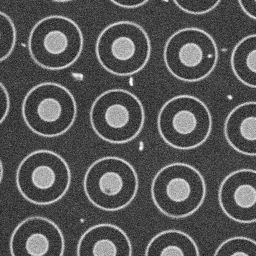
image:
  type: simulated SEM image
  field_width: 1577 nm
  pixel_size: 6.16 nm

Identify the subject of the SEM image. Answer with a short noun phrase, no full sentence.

an array of small figures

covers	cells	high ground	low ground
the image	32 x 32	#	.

###############..#####.....###..
########################.######.
.#####..########################
..##......####...###############
..##......###.....####....######
..##......##.......##......###..
.###......##.......##......##...
####.....####.....###......##...
######.######.....###......##...
######################...#####..
###############################.
.###....######..################
.##......###.....#####...#######
.##......###......##......####..
.##......##.......##......###...
####.....###......##......##....
#####...####.....###......##....
##############..#####....####...
##############################..
####...#########################
###.....####....################
##.......##......###.....#####..
##.......##......##......###....
##......###......##.......##....
###.....###......##......##.....
############....####.....###....
#####################...####....
###...########################..
##.....#####..##################
##......##......####...#########
#.......##......###.....####....
##......##......##.......##.....